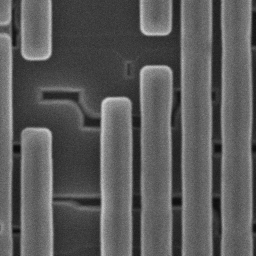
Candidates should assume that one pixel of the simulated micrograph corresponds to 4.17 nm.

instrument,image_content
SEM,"wiring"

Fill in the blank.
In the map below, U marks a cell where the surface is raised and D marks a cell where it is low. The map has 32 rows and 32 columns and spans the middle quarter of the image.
DDDDDDDDDDDDDDDDDDDDDDDDDDDDDUUU
DDDDDDDDDDDDDDDDDDDDUUUUUUUDDUUU
DDDDDDDDDDDDDDDDDDDUUUUUUUUDDUUU
DDDDDDDDDDDDDDDDDDDUUUUUUUUDDUUU
DDDDDDDDDDDDDDDDDDDUUUUUUUUDDUUU
DDDDDDDDDDDDDDDDDDDUUUUUUUUDDUUU
DDDDDDDDDDDDDDDDDDDUUUUUUUUDDUUU
DDDDDDDDDDDDDDDDDDDUUUUUUUUDDUUU
DDDDDDDDDDDDUUUDDDDUUUUUUUUDDUUU
DDDDDDDDDDUUUUUUUDDUUUUUUUUDDUUU
DDDDDDDDDUUUUUUUUDDUUUUUUUUDDDUU
DDDDDDDDDUUUUUUUUDDUUUUUUUUDDDUU
DDDDDDDDDDUUUUUUUDDUUUUUUUUDDDUU
DDDDDDDDDDUUUUUUUDDDUUUUUUUDDDUU
DDDDDDDDDUUUUUUUUDDDUUUUUUDDDDUU
DDDDDDDDDUUUUUUUUDDDUUUUUUDDDDUU
DDDDDDDDDUUUUUUUUDDDUUUUUUUDDDUU
DDDDDDDDDUUUUUUUUDDUUUUUUUUDDDUU
DDDDDDDDDUUUUUUUUDDUUUUUUUUDDDUU
DDDDDDDDDUUUUUUUUDDUUUUUUUUDDDUU
DDDDDDDDDUUUUUUUUDDUUUUUUUUDDDUU
DDDDDDDDDUUUUUUUUDDUUUUUUUUDDDUU
DDDDDDDDDUUUUUUUUDDDUUUUUUUDDDUU
DDDDDDDDDUUUUUUUUDDDUUUUUUUDDDUU
DDDDDDDDDUUUUUUUUDDDUUUUUUUDDDUU
DDDDDDDDDUUUUUUUUDDDUUUUUUUDDDUU
DDDDDDDDDUUUUUUUUDDUUUUUUUUDDDUU
DDDDDDDDDUUUUUUUUDDUUUUUUUUDDDUU
DDDDDDDDDUUUUUUUUDDUUUUUUUUDDDUU
DDDDDDDDDUUUUUUUUDDUUUUUUUUDDDUU
DDDDDDDDDUUUUUUUUDDUUUUUUUUDDDUU
DDDDDDDDDUUUUUUUUDDUUUUUUUUDDDUU